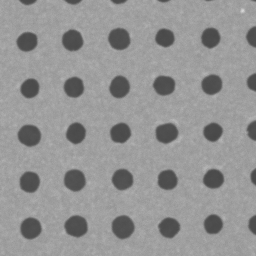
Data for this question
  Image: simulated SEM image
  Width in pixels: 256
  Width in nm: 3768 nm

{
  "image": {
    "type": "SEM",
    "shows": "a regular array of holes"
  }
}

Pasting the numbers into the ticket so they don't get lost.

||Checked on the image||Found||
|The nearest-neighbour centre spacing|668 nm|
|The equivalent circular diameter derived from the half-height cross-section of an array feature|311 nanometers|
